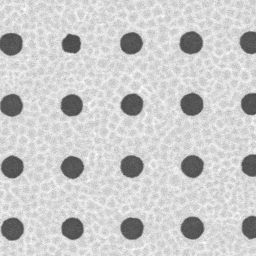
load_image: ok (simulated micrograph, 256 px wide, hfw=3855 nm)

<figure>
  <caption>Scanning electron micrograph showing a regular array of holes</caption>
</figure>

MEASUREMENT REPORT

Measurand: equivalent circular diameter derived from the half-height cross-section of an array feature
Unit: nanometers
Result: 347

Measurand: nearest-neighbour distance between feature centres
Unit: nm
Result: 899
